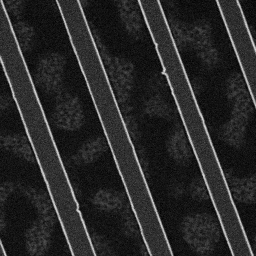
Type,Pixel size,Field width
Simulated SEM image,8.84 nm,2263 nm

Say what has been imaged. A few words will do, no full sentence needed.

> one or a few lines or trenches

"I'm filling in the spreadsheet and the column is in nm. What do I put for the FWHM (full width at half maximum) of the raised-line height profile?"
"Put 182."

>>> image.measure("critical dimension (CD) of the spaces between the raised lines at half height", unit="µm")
0.481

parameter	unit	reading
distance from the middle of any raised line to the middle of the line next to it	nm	659